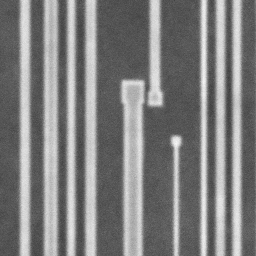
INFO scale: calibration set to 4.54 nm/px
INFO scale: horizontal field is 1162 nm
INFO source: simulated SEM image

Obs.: groups of lines, slits or small figures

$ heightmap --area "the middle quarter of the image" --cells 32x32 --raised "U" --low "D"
DUUDDDUUDDDDDDDDDDDDDDUUDDDDDDDD
DUUDDDUUDDDDDDDDDDDDDDUUDDDDDDDD
DUUDDDUUDDDDDDDDDDDDDDUUDDDDDDDD
DUUDDDUUDDDDDDDDDDDDDDUUDDDDDDDD
DUUDDDUUDDDDDDDUUUUUDDUUDDDDDDDD
DUUDDDUUDDDDDDDUUUUUDDUUDDDDDDDD
DUUDDDUUDDDDDDDUUUUUDDUUDDDDDDDD
DUUDDDUUDDDDDDDUUUUUDUUUDDDDDDDD
DUUDDDUUDDDDDDDUUUUUDUUUDDDDDDDD
DUUDDDUUDDDDDDDUUUUUDUUUDDDDDDDD
DUUDDDUUDDDDDDDUUUUDDDDDDDDDDDDD
DUUDDDUUDDDDDDDUUUUDDDDDDDDDDDDD
DUUDDDUUDDDDDDDUUUUDDDDDDDDDDDDD
DUUDDDUUDDDDDDDUUUUDDDDDDDDDDDDD
DUUDDDUUDDDDDDDUUUUDDDDDDDDDDDDD
DUUDDDUUDDDDDDDUUUUDDDDDDDDDDDDD
DUUDDDUUDDDDDDDUUUUDDDDDDDDDDDDD
DUUDDDUUDDDDDDDUUUUDDDDDDDDDDDDD
DUUDDDUUDDDDDDDUUUUDDDDDDDDUUDDD
DUUDDDUUDDDDDDDUUUUDDDDDDDDUUDDD
DUUDDDUUDDDDDDDUUUUDDDDDDDDDUDDD
DUUDDDUUDDDDDDDUUUUDDDDDDDDDDDDD
DUUDDDUUDDDDDDDUUUUDDDDDDDDDDDDD
DUUDDDUUDDDDDDDUUUUDDDDDDDDDDDDD
DUUDDDUUDDDDDDDUUUUDDDDDDDDDDDDD
DUUDDDUUDDDDDDDUUUUDDDDDDDDDDDDD
DUUDDDUUDDDDDDDUUUUDDDDDDDDDDDDD
DUUDDDUUDDDDDDDUUUUDDDDDDDDDDDDD
DUUDDDUUDDDDDDDUUUUDDDDDDDDDDDDD
DUUDDDUUDDDDDDDUUUUDDDDDDDDDDDDD
DUUDDDUUDDDDDDDUUUUDDDDDDDDDDDDD
DUUDDDUUDDDDDDDUUUUDDDDDDDDDDDDD